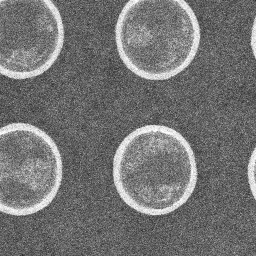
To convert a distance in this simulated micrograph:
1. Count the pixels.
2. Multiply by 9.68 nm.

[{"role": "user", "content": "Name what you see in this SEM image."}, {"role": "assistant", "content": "raised bodies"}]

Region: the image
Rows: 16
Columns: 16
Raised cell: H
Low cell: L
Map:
HHHLLLLLHHHHLLLL
HHHHLLLHHHHHLLLL
HHHHLLLHHHHHLLLL
HHHLLLLLHHHHLLLL
HHLLLLLLLHHLLLLL
LLLLLLLLLLLLLLLL
LLLLLLLLLLLLLLLL
LLLLLLLLLLLLLLLL
HHHLLLLLHHHLLLLL
HHHLLLLLHHHHLLLL
HHHHLLLHHHHHLLLL
HHHHLLLHHHHHLLLL
HHHLLLLLHHHLLLLL
LLLLLLLLLLLLLLLL
LLLLLLLLLLLLLLLL
LLLLLLLLLLLLLLLL